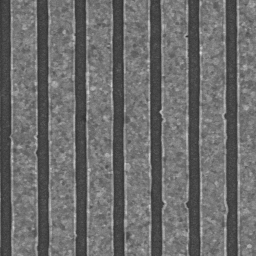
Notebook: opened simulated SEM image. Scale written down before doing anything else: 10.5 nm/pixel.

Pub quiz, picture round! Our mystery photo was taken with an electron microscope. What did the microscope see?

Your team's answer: parallel lines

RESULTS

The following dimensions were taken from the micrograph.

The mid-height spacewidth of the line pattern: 123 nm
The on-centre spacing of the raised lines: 0.395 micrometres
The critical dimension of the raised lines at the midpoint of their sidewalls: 271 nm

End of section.